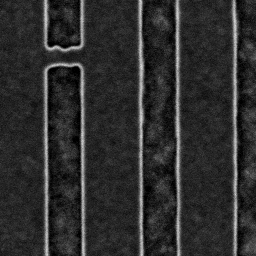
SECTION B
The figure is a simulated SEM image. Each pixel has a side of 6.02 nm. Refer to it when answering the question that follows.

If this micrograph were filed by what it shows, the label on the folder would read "one or a few lines or trenches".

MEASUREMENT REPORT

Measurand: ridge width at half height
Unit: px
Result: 58.6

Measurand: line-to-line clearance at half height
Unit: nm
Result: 218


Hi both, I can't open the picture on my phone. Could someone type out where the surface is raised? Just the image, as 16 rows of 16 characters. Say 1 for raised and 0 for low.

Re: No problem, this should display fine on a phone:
1110011110011110
1110011110011110
1110011110011110
1111111110011110
1110011110011110
1110011110011110
1110011110011110
1110011110011110
1110011110011110
1110011110011110
1110011110011110
1110011110011110
1110011110011110
1110011110011110
1110011110011110
1110011110011110